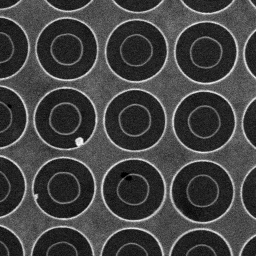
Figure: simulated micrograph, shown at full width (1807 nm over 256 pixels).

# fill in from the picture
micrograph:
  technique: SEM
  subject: an array of small figures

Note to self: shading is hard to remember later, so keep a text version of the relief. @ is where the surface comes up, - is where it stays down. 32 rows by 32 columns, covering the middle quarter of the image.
-------@@@@--------------@@@@---
------@@@@@@------------@@@@@---
-----@@@@@@@@----------@@@@@@@--
----@@@@@@@@@@--------@@@@@@@@@-
@@@@@@@@@@@@@@@@@@@@@@@@@@@@@@@@
@@@@@@@@@@@@@@@@@@@@@@@@@@@@@@@@
---@@@@@@@@@@@@@@--@@@@@@@@@@@@@
-----@@@@@@@@@--------@@@@@@@@@@
------@@@@@@@----------@@@@@@@--
-------@@@@@------------@@@@@---
@@-----@@@@-----@@@-----@@@@----
@@@-----@@-----@@@@@@----@@@----
@@@@----@@----@@@@@@@----@@@----
@@@@----@@----@@@@@@@----@@----@
@@@@----@@----@@@@@@@-----@----@
@@@@----@@----@@@@@@@----@@----@
@@@-----@@-----@@@@@@----@@@----
-------@@@@-----@@@------@@@----
------@@@@@-------------@@@@----
---@@@@@@@@@-----------@@@@@@---
---@@@@@@@@@@---------@@@@@@@@--
@@@@@@@@@@@@@@@@----@@@@@@@@@@@@
@@@@@@@@@@@@@@@@@@@@@@@@@@@@@@@@
-@@@@@@@@@@@@@@@@@@@@@@@@@@@@@@@
----@@@@@@@@@@-------@@@@@@@@@@@
-----@@@@@@@----------@@@@@@@@--
------@@@@@------------@@@@@@---
@@-----@@@@-------------@@@@----
@@@----@@@-----@@@@@-----@@@----
@@@-----@@----@@@@@@@----@@-----
@@@@----@@----@@@@@@@----@@----@
@@@@----@----@@@@@@@@----@@----@